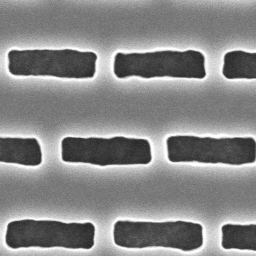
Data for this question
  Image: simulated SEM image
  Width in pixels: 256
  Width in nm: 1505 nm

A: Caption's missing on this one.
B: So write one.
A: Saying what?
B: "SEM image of holes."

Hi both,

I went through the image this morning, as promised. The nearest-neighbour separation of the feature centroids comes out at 594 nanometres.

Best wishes